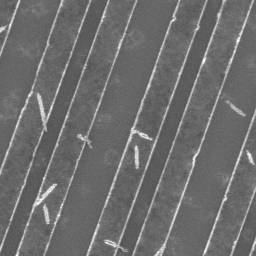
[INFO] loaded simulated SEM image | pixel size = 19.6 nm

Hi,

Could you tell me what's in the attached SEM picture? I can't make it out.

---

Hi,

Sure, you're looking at parallel lines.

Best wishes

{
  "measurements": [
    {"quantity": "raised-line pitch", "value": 1040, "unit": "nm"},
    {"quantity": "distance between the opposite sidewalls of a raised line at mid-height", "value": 528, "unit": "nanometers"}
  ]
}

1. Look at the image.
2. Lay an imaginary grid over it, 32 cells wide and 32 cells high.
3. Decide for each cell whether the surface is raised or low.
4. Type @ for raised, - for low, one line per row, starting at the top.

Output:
@@------@@@--@@@@-----@@@@--@@@@
@@-----@@@@--@@@@-----@@@--@@@@-
@@-----@@@---@@@-----@@@@--@@@@-
@------@@@--@@@@-----@@@@--@@@--
@-----@@@@--@@@@-----@@@--@@@@--
------@@@---@@@-----@@@@--@@@@--
------@@@--@@@@-----@@@@--@@@---
-----@@@@--@@@------@@@--@@@@---
-----@@@--@@@@-----@@@@--@@@@---
-----@@@--@@@@-----@@@---@@@----
----@@@@--@@@------@@@--@@@@----
----@@@--@@@@-----@@@@--@@@@----
---@@@@--@@@@-----@@@---@@@-----
---@@@---@@@-----@@@@--@@@@-----
---@@@--@@@@-----@@@@--@@@------
--@@@@--@@@@-----@@@---@@@-----@
--@@@---@@@-----@@@@--@@@@-----@
-@@@@--@@@@-----@@@@--@@@------@
-@@@@--@@@------@@@--@@@@-----@@
-@@@---@@@-----@@@@--@@@@-----@@
@@@@--@@@@-----@@@---@@@------@@
@@@@--@@@------@@@--@@@@-----@@@
@@@--@@@@-----@@@@--@@@@-----@@@
@@@--@@@@-----@@@---@@@-----@@@@
@@---@@@-----@@@@--@@@@-----@@@@
@@--@@@@-----@@@@--@@@------@@@-
@@--@@@@-----@@@---@@@-----@@@@-
@---@@@-----@@@@--@@@@-----@@@@-
@--@@@@-----@@@@--@@@------@@@--
@--@@@------@@@--@@@@-----@@@@--
---@@@-----@@@@--@@@@-----@@@@--
--@@@@-----@@@---@@@------@@@--@